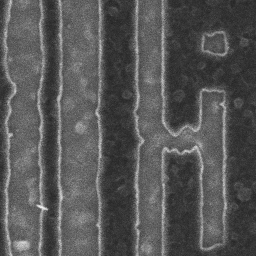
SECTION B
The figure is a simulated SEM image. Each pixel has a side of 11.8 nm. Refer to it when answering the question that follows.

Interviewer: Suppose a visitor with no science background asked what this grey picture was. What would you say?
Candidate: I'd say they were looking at one or a few lines or trenches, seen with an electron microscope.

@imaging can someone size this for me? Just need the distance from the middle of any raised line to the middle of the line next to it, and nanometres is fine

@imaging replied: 784